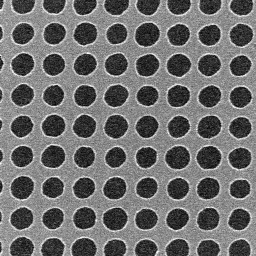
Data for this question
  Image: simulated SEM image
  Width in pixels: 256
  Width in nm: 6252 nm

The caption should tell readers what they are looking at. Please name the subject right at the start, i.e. a regular array of holes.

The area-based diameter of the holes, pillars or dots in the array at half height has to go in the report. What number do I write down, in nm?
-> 558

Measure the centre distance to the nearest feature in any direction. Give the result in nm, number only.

747